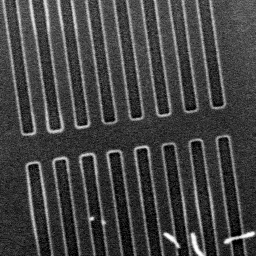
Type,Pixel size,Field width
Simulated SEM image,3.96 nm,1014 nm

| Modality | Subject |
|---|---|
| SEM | groups of lines, slits or small figures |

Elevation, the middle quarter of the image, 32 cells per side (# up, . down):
#...####...####...####...####...
#...####...####...####...####...
#...####...####...####...####...
#....###...####...####...####...
#....####...###....###....###...
##...####...####...###....###...
##...####...####...####...###...
##...####...####...####...###...
##...####...####...####...####..
##....###...####...####...####..
##....###....###...####...####..
###...###....###....###...####..
###...###....####...####..######
###...####...####..#############
###...####...###################
###..###########################
################################
################################
################################
################################
#########################...###.
##################...####...####
######.####...####...####...####
####....###...####...####...####
.###....###...####....###...####
.###....###....###....###...####
.####...####...###....###....###
.####...####...####...###....###
.####...####...####...####...###
.####...####...####...####...###
..###...####...####...####...###
..###....###...####...####...###